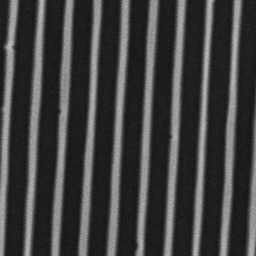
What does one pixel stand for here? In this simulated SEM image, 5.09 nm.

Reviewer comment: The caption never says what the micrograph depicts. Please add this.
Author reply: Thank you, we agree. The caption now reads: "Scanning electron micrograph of parallel lines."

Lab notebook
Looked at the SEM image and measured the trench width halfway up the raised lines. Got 103 nm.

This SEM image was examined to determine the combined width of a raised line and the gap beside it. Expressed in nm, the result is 143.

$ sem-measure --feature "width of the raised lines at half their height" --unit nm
39.3